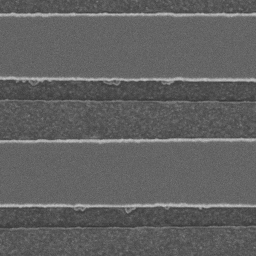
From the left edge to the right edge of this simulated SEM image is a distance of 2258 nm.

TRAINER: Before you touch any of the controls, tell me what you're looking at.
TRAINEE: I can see lines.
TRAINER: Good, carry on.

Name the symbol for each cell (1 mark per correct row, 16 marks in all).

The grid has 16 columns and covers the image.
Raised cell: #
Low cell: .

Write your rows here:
................
################
################
################
################
................
................
................
................
################
################
################
################
................
................
................